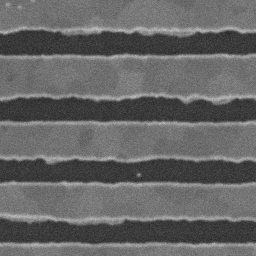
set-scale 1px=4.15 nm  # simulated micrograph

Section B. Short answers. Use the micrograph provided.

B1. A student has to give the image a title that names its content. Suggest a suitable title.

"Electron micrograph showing lines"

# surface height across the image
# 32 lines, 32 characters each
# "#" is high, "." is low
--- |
################################
################################
################################
################################
................................
................................
................................
################################
################################
################################
################################
################################
..........................#.....
................................
................................
################################
################################
################################
################################
################################
................................
................................
................................
################################
################################
################################
################################
.......####......#...........#.#
................................
................................
###########..####.######..######
################################